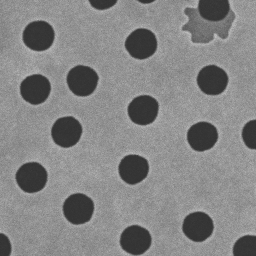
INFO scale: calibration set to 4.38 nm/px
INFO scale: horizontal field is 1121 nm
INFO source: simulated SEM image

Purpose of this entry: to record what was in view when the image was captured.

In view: a regular array of holes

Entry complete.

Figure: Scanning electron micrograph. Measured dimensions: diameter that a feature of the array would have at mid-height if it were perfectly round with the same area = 135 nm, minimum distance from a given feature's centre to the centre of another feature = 250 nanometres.